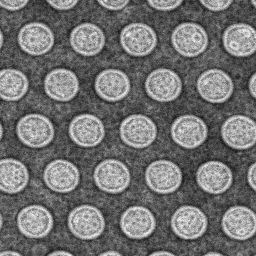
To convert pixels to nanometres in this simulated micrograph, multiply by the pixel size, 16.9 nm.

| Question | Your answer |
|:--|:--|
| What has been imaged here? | a regular array of raised bodies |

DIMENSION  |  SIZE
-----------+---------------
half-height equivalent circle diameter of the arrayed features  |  32.4 pixels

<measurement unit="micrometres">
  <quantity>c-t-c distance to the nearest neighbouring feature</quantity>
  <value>0.863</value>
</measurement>